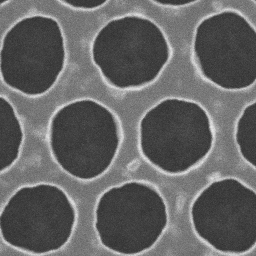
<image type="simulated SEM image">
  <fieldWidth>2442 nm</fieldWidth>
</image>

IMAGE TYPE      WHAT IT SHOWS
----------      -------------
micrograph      holes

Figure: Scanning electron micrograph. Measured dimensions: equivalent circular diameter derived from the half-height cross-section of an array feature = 72.5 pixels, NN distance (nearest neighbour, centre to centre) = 0.875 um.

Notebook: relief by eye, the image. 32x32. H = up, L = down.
HHHHHHHHLLLLLHHHHHHHLLLHHHHHHHHH
HHHHHHHHHHHHHHHHHHHHHHHHHHHHLHHH
HHHLLLLHHHHHHHHLLLLHHHHHHHLLLLLH
HLLLLLLHHHHHHLLLLLLLHHHHHLLLLLLL
HLLLLLLLHHHHLLLLLLLLHHHHLLLLLLLL
LLLLLLLLHHHHLLLLLLLLLHHHLLLLLLLL
LLLLLLLLHHHHLLLLLLLLLHHHLLLLLLLL
LLLLLLLLHHHHLLLLLLLLLHHHHLLLLLLL
LLLLLLLLHHHHLLLLLLLLHHHHHLLLLLLL
LLLLLLLHHHHHHLLLLLLLHHHHHHLLLLLL
HLLLLLLHHHHHHHLLLLHHHHHHHHHLLLLH
HHHLLLHHHHHHHHHHHHHHHHHHHHHHHHHH
LHHHHHHHHHHHHHHHHHHHHLLHHHHHHHHH
LLHHHHHHLLLLLHHHHHHLLLLLLHHHHHHL
LLHHHHHLLLLLLLHHHHLLLLLLLLHHHHLL
LLLHHHLLLLLLLLLHHHLLLLLLLLHHHHLL
LLLHHHLLLLLLLLLHHHLLLLLLLLHHHHLL
LLLHHHLLLLLLLLLHHHLLLLLLLLLHHHLL
LLHHHHLLLLLLLLLHHHLLLLLLLLHHHHLL
LLHHHHHLLLLLLLHHHHLLLLLLLLHHHHLL
LHHHHHHLLLLLLLHHHHHLLLLLHHHHHHHL
HHHHHHHHLLLLLHHHHHHHHLLHHHHHHHHH
HHHHHHHHHHHHHHHHHHHHHHHHHHHHLHHH
HHHLLLLHHHHHHHLLLLLHHHHHHHLLLLLH
HHLLLLLLHHHHHLLLLLLLHHHHHLLLLLLL
HLLLLLLLLHHHLLLLLLLLLHHHLLLLLLLL
LLLLLLLLLHHHLLLLLLLLLHHHLLLLLLLL
LLLLLLLLLHHHLLLLLLLLLHHHLLLLLLLL
LLLLLLLLLHHHLLLLLLLLLHHHLLLLLLLL
LLLLLLLLLHHHLLLLLLLLHHHHHLLLLLLL
HLLLLLLLHHHHHLLLLLLHHHHHHHLLLLLL
HHHHLLHHHHHHHHHLLLHHHHHHHHHHLLLH